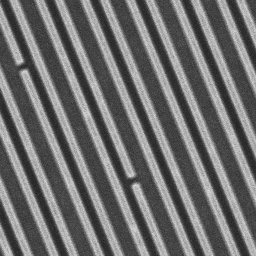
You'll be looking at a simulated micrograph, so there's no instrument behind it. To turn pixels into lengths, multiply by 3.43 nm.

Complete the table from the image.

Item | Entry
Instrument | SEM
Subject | parallel lines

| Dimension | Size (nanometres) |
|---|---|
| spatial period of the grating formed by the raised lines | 71.7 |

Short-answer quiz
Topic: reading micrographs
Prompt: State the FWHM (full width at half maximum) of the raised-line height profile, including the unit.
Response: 8.54 pixels